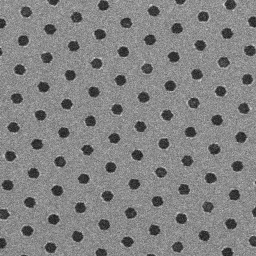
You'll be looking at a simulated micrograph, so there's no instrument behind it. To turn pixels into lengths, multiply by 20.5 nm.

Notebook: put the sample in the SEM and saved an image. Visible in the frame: a regular array of holes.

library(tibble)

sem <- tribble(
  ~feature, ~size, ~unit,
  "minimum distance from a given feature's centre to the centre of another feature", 589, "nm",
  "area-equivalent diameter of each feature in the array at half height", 245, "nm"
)